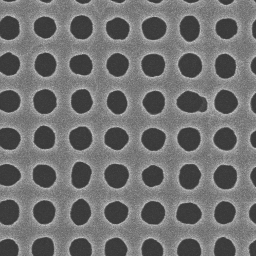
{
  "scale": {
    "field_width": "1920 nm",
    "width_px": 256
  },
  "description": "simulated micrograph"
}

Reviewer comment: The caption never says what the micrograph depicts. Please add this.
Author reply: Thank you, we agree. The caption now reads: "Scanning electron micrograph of a regular array of holes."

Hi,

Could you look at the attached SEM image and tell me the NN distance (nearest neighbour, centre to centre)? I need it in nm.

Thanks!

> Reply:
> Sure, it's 268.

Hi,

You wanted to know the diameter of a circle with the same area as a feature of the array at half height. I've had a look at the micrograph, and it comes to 0.177 microns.